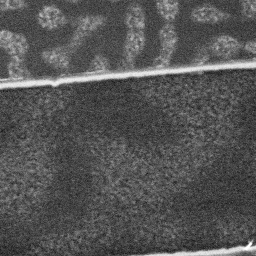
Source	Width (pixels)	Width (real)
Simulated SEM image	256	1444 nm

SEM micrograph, one or a few lines or trenches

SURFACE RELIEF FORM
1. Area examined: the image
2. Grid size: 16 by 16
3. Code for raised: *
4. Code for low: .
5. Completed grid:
****************
****************
****************
****************
**********......
................
................
................
................
................
................
................
................
................
................
...............*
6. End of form